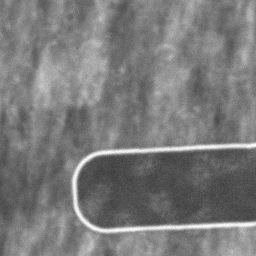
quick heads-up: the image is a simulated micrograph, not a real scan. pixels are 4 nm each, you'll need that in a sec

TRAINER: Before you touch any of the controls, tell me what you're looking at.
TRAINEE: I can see one or a few lines or trenches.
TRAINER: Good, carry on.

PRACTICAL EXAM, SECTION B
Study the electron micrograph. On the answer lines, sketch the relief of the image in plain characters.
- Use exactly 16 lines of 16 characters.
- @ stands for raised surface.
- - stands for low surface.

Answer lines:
----------------
----------------
----------------
----------------
----------------
----------------
----------------
----------------
----------------
-------@@@@@@@@@
-----@@@@@@@@@@@
-----@@@@@@@@@@@
-----@@@@@@@@@@@
-----@@@@@@@@@@@
----------------
----------------